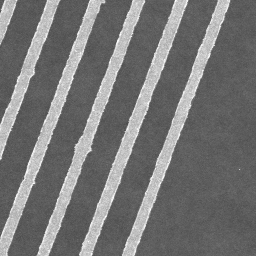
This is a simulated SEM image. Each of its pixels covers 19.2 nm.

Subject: parallel lines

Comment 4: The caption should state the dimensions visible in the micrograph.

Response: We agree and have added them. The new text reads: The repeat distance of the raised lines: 765 nm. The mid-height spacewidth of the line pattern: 545 nm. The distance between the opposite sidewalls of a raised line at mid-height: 206 nanometres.